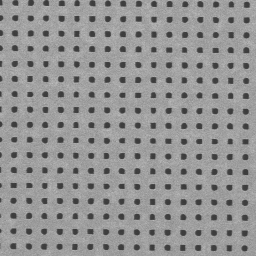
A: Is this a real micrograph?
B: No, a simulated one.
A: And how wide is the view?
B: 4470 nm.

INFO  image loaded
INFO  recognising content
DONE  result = a regular array of holes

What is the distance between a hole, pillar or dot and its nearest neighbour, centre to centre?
262 nanometres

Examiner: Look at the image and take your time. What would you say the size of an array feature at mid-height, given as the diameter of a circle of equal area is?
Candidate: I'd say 113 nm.